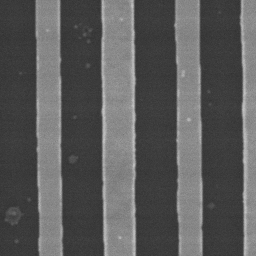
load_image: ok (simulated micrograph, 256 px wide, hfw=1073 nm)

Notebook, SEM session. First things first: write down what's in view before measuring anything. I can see lines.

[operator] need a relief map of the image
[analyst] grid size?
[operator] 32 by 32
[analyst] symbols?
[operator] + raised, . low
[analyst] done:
.....++......++++.....+++.....++
.....++......++++.....+++.....++
.....++......++++.....+++.....++
.....++......++++.....+++.....++
.....++......++++.....+++.....++
.....++......++++.....+++.....++
.....++......++++.....+++.....++
.....+++.....++++.....+++.....++
.....++......++++.....+++.....++
.....+++.....++++.....+++.....++
.....+++.....++++.....+++.....++
.....+++.....++++.....+++.....++
.....+++.....++++.....+++.....++
.....+++.....++++.....+++.....++
.....+++.....++++.....+++.....++
.....+++.....++++.....+++.....++
.....+++.....++++.....+++.....++
.....+++.....++++.....+++.....++
.....+++.....++++.....+++......+
.....+++.....++++.....+++.....++
.....+++.....++++.....+++......+
.....+++.....++++.....+++......+
.....+++.....++++.....+++......+
.....+++.....++++.....+++......+
.....+++.....++++.....+++......+
.....+++.....++++.....+++......+
.....+++.....++++.....+++......+
.....+++.....++++.....+++......+
.....+++.....++++.....+++......+
.....+++.....++++.....+++......+
.....+++.....++++.....+++......+
.....+++.....++++.....+++......+